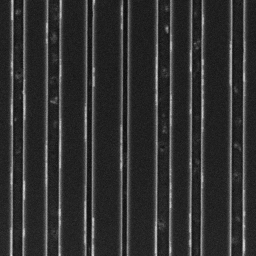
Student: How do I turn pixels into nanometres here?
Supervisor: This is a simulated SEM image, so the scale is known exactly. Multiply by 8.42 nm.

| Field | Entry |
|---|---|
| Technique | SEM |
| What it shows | parallel lines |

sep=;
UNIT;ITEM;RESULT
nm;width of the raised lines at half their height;241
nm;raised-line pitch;305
